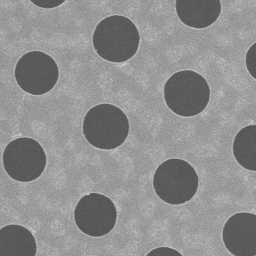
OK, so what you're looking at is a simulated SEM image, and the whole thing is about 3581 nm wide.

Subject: holes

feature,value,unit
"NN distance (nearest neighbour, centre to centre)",1210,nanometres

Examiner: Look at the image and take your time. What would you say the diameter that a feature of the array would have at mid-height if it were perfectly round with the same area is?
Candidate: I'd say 640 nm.